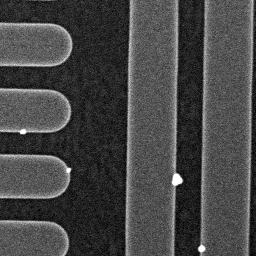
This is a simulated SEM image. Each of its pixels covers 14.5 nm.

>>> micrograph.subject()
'groups of lines, slits or small figures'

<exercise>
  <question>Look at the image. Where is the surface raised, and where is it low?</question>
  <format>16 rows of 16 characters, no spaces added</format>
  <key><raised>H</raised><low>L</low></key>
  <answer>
LLLLLLLLHHHLLHHH
LLLLLLLLHHHLLHHH
HHHHLLLLHHHLLHHH
HHHHLLLLHHHLLHHH
LLLLLLLLHHHLLHHH
LLLLLLLLHHHLLHHH
HHHHLLLLHHHLLHHH
HHHHLLLLHHHLLHHH
LLLLLLLLHHHLLHHH
LLLLLLLLHHHLLHHH
HHHHLLLLHHHLLHHH
HHHHLLLLHHHLLHHH
LLLLLLLLHHHLLHHH
LLLLLLLLHHHLLHHH
HHHHLLLLHHHLLHHH
HHHHLLLLHHHLHHHH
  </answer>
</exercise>